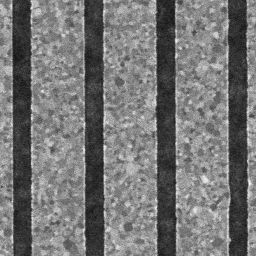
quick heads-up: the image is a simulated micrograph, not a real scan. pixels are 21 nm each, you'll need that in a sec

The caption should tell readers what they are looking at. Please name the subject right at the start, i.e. one or a few lines or trenches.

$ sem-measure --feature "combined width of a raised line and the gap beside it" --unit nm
1510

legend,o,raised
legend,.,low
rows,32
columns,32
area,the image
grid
o...oooooo...oooooo...oooooo...o
o...oooooo...oooooo...oooooo...o
o...oooooo...oooooo...oooooo...o
o...oooooo...oooooo...oooooo...o
o...oooooo...oooooo...oooooo...o
o...oooooo...oooooo...oooooo...o
o...oooooo...oooooo...oooooo...o
oo..oooooo...oooooo...oooooo...o
oo..oooooo...oooooo...oooooo...o
oo..ooooooo..oooooo...oooooo...o
oo..ooooooo..oooooo...oooooo...o
oo..ooooooo..oooooo...oooooo...o
oo..ooooooo..ooooooo..oooooo...o
oo..ooooooo..oooooo...oooooo...o
oo..ooooooo..ooooooo..oooooo...o
oo..ooooooo..oooooo...oooooo...o
oo..ooooooo..ooooooo..oooooo...o
oo..ooooooo..ooooooo..oooooo...o
oo..ooooooo..ooooooo..oooooo...o
oo..oooooo...ooooooo..oooooo...o
oo..ooooooo..ooooooo..oooooo...o
oo..ooooooo..ooooooo..oooooo...o
oo..ooooooo..ooooooo..oooooo...o
oo..ooooooo..ooooooo..ooooooo..o
oo..oooooo...ooooooo..ooooooo..o
oo..ooooooo..ooooooo..ooooooo..o
oo..ooooooo..ooooooo..ooooooo..o
oo..ooooooo..ooooooo..oooooo...o
oo..ooooooo..ooooooo..oooooo...o
o...ooooooo..ooooooo..ooooooo..o
oo..ooooooo..oooooo...ooooooo..o
oo..ooooooo..ooooooo..oooooo...o